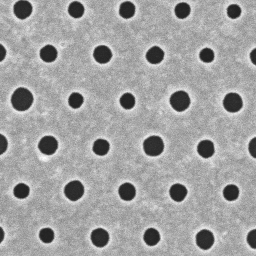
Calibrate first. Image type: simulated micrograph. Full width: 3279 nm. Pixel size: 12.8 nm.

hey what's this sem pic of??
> a regular array of holes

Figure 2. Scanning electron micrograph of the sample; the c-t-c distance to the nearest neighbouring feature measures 659 nm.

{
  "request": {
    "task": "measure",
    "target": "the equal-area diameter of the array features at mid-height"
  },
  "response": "238 nanometres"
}